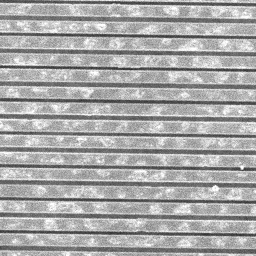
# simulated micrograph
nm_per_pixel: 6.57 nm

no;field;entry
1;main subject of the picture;parallel lines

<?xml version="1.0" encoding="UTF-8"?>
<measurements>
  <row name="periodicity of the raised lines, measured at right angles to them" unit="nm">108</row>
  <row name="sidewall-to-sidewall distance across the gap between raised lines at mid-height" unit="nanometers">28.7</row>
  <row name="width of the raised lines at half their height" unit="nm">81.3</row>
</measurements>